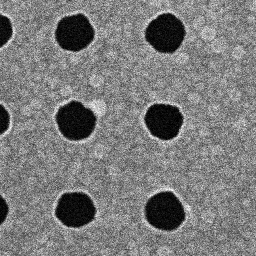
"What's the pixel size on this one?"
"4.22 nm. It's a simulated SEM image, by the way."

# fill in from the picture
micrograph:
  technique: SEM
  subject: holes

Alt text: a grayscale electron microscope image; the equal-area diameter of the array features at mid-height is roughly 162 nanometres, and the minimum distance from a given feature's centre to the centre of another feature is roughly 372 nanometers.